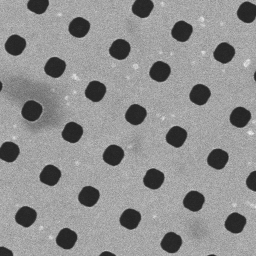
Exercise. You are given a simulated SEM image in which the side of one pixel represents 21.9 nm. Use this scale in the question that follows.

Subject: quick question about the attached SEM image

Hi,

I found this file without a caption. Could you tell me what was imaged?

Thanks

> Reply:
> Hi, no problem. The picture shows a regular array of holes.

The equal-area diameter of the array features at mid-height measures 460 nm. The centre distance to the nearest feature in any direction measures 1.01 um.